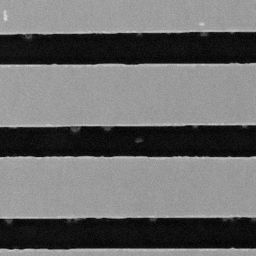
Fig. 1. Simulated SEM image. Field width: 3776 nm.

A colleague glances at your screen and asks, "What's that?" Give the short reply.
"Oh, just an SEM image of lines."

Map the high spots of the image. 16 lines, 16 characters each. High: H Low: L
HHHHHHHHHHHHHHHH
HHHHHHHHHHHHHHHH
LLLLLLLLLLLLLLLL
LLLLLLLLLLLLLLLL
HHHHHHHHHHHHHHHH
HHHHHHHHHHHHHHHH
HHHHHHHHHHHHHHHH
HHHHHHHHHHHHHHHH
LLLLLLLLLLLLLLLL
LLLLLLLLLLLLLLLL
HHHHHHHHHHHHHHHH
HHHHHHHHHHHHHHHH
HHHHHHHHHHHHHHHH
HHHHHHHHHHHHHHHH
LLLLLLLLLLLLLLLL
LLLLLLLLLLLLLLLL